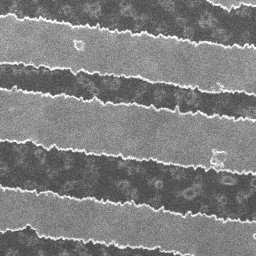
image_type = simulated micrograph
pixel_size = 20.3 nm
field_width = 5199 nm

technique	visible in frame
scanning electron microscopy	one or a few lines or trenches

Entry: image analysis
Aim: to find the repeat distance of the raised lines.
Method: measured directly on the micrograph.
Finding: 1660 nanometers